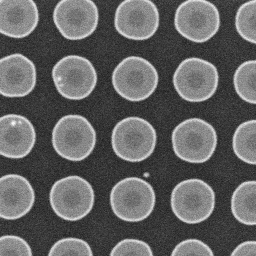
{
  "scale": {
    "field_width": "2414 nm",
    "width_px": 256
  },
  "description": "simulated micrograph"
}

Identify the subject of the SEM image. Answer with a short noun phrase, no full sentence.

an array of small figures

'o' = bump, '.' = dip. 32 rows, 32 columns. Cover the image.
oooo...ooooo...oooo....ooo.....o
ooooo..ooooo...ooooo..ooooo...oo
ooooo..ooooo..oooooo..ooooo...oo
oooo...ooooo...ooooo..ooooo...oo
.oo.....ooo.....ooo....ooo....oo
................................
................................
oooo....ooo.....oo.....oo.......
oooo...ooooo...oooo...ooooo...oo
oooo...ooooo..oooooo..ooooo..ooo
oooo...ooooo..oooooo..ooooo..ooo
oooo...oooo....oooo...ooooo...oo
................oo......o......o
................................
.o......oo......................
oooo...oooo....oooo....ooo....oo
oooo...ooooo..ooooo...ooooo..ooo
oooo...ooooo..ooooo...ooooo..ooo
oooo...ooooo..ooooo...ooooo..ooo
.oo.....ooo....ooo....oooo....oo
................................
................................
ooo.....ooo....ooo......o.......
oooo...oooo...ooooo...oooo....oo
oooo..oooooo..ooooo...ooooo..ooo
oooo..oooooo..ooooo..oooooo..ooo
ooo....oooo...ooooo...oooo...ooo
................o......oo.....oo
................................
................................
ooo....oooo....ooo....ooo.....oo
oooo..ooooo...ooooo...oooo...ooo